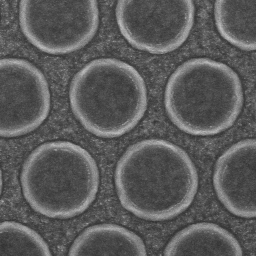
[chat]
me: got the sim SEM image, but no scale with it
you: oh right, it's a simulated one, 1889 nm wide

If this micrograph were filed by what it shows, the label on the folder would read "raised bodies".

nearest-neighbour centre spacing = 703 nanometers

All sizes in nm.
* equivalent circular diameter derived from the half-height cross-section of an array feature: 532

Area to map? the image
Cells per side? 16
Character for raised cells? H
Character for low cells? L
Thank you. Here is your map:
LHHHHHLLHHHHLLHH
LHHHHHLLHHHHLLHH
LLHHHLLLHHHLLLHH
LLLLLLLLLLLLLLLL
HHLLLHHHLLLHHHLL
HHHLLHHHHLLHHHHL
HHHLLHHHHLLHHHHL
HHLLLHHHLLLHHHLL
LLLLLLLLLLLLLLLL
LLHHHLLLHHHLLLHH
LLHHHHLHHHHHLLHH
LLHHHHLHHHHHLLHH
LLHHHHLLHHHHLLHH
LLLLLLLLLHLLLLLL
HHLLLLHHLLLLHHLL
HHHLLHHHHLLHHHHL